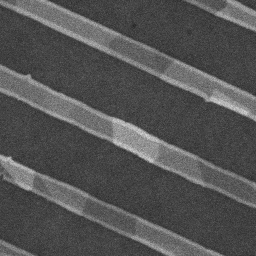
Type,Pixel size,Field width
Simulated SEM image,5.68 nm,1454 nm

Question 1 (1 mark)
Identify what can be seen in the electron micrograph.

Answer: one or a few lines or trenches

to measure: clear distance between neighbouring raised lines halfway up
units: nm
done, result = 342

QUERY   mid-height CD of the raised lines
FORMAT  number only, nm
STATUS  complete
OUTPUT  108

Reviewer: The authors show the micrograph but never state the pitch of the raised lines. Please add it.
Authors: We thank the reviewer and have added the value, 452 nm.